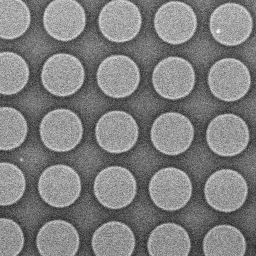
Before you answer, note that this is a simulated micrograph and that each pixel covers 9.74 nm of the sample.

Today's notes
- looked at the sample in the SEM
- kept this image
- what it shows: an array of small figures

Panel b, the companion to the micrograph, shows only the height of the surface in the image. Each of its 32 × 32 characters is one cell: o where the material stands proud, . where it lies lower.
ooo...oooo....ooo....oo.........
oooo..oooo...oooo...oooo...oooo.
oooo.oooooo.oooooo.ooooo..ooooo.
ooo...oooo...oooo..ooooo..ooooo.
oo.....ooo...oooo...oooo...oooo.
............................oo..
................................
ooo...oooo...ooo....ooo.....o...
ooo..ooooo..ooooo..ooooo...oooo.
oooo.ooooo..ooooo..ooooo..ooooo.
ooo..ooooo..ooooo..ooooo..ooooo.
oo....ooo....ooo....oooo...oooo.
............................o...
................................
ooo...oooo...ooo....ooo.....o...
ooo..ooooo..ooooo..ooooo..ooooo.
ooo..ooooo..ooooo..ooooo..ooooo.
ooo..ooooo..ooooo..ooooo..ooooo.
oo....ooo....ooo....ooo...ooooo.
................................
o...............................
ooo...ooo....ooo....ooo....oo...
ooo..ooooo..ooooo..ooooo..oooo..
ooo..ooooo..ooooo..ooooo..ooooo.
ooo..ooooo..ooooo..ooooo..ooooo.
o.....ooo....ooo....ooo...oooo..
................................
o...............................
oo...oooo...oooo....ooo....oo...
ooo..ooooo..ooooo..oooo...oooo..
ooo..ooooo..ooooo..ooooo.oooooo.
oo...oooo...oooo...ooooo..oooo..